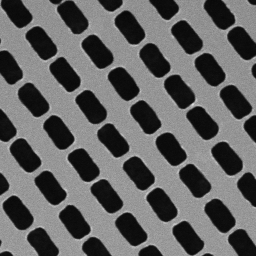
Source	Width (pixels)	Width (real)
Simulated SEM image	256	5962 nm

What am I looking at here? a regular array of holes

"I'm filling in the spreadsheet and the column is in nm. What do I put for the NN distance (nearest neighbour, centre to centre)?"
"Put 922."